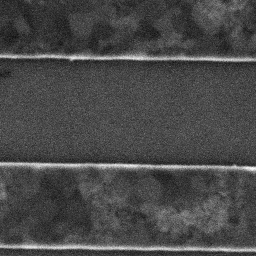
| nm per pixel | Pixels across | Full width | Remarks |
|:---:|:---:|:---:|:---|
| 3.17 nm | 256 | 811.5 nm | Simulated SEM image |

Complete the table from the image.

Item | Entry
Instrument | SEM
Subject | wiring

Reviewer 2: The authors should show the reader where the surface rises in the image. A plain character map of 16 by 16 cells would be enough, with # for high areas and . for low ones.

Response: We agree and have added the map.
################
################
################
################
................
................
................
................
................
................
################
################
################
################
################
.....###########